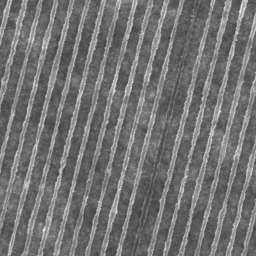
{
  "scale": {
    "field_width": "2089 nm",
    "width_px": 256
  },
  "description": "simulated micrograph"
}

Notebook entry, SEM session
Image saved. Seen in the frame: parallel lines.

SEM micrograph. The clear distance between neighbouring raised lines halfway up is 0.096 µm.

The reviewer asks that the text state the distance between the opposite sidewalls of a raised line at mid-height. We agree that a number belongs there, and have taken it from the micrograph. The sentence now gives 29.6 nanometres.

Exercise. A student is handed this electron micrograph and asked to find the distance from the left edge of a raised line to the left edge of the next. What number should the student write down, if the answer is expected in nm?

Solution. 124